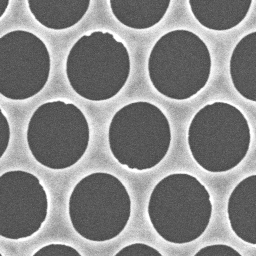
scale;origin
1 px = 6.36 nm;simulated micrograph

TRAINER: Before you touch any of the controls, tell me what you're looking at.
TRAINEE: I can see holes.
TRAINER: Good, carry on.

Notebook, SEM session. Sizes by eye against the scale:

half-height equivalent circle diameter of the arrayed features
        423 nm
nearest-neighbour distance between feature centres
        504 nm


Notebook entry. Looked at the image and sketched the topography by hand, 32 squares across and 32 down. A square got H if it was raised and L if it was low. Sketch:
LHHLLLLLLLLHHHLLLLLLLHHHLLLLLLLH
LHHHLLLLLLLHHHLLLLLLLHHHLLLLLLLH
HHHHHLLLLLHHHHHLLLLLHHHHHLLLLLHH
HHHHHHLLHHHHHHHHHLLHHHHHHHLLLHHH
LLLLLHHHHHLLLLHHHHHHLLLLLHHHHHHL
LLLLLLHHHLLLLLLHHHHLLLLLLLHHHHLL
LLLLLLHHHLLLLLLLHHHLLLLLLLHHHLLL
LLLLLLHHLLLLLLLLHHHLLLLLLLHHHLLL
LLLLLLHHLLLLLLLLHHLLLLLLLLHHHLLL
LLLLLLHHLLLLLLLLHHHLLLLLLLHHHLLL
LLLLLLHHHLLLLLLLHHHLLLLLLLHHHLLL
LLLLLHHHHLLLLLLHHHHHLLLLLHHHHHLL
HHLHHHHHHHHLLHHHHHHHHHLHHHHHHHHL
HHHHHLLLLLHHHHHLLLLLHHHHHLLLLLHH
LHHHLLLLLLLHHHLLLLLLLHHHLLLLLLHH
LHHHLLLLLLLHHHLLLLLLLHHHLLLLLLLH
LHHLLLLLLLLHHHLLLLLLLHHHLLLLLLLH
LHHLLLLLLLLHHHLLLLLLLHHLLLLLLLLH
LHHHLLLLLLLHHHLLLLLLLHHHLLLLLLLH
HHHHLLLLLLHHHHLLLLLLLHHHLLLLLLLH
HHHHHLLLLHHHHHHLLLLLHHHHHLLLLLHH
HLLHHHHHHHHHHHHHHHHHHHHHHHLLHHHH
LLLLLHHHHHLLLLLHHHHHLLLLLHHHHHLL
LLLLLHHHHLLLLLLLHHHLLLLLLLHHHLLL
LLLLLLHHHLLLLLLLHHHLLLLLLLHHHLLL
LLLLLLHHHLLLLLLLHHHLLLLLLLHHHLLL
LLLLLLHHHLLLLLLLHHLLLLLLLLLHLLLL
LLLLLLHHHLLLLLLLHHHLLLLLLLHHHLLL
LLLLLHHHHLLLLLLLHHHLLLLLLLHHHLLL
LLLLHHHHHHLLLLLHHHHHLLLLLHHHHHLL
HHHHHHHHHHHHHHHHHLHHHHHHHHHLHHHL
HHHHHLLLLLHHHHHLLLLLHHHHHLLLLLHH